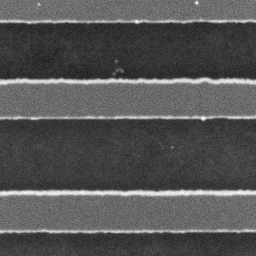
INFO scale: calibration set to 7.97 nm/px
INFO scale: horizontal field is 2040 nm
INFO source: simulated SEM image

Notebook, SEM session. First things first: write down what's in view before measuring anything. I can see lines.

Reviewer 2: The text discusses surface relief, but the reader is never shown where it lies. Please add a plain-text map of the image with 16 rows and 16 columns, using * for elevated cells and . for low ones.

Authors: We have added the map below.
****************
................
................
................
................
****************
****************
................
................
................
................
................
****************
****************
************..*.
................